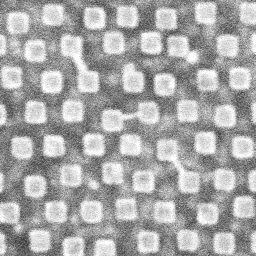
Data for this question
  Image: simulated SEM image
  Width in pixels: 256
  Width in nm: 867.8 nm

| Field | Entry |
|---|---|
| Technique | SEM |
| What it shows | a regular array of raised bodies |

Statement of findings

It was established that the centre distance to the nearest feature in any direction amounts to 112 nm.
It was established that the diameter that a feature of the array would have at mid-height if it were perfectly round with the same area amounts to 69.5 nm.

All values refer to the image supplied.